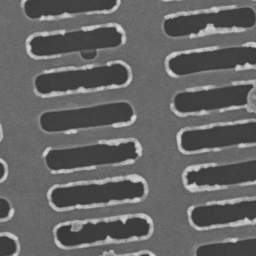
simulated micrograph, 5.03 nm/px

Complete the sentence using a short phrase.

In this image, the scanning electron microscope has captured holes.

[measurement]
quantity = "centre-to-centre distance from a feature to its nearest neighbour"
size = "192 nanometers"